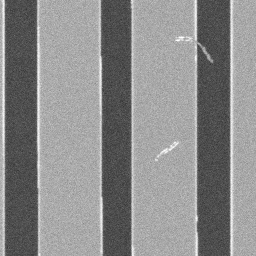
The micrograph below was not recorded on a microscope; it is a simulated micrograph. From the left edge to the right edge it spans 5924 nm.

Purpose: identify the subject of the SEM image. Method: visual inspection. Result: lines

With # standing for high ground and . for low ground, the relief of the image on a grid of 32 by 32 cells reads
.....#######.....########....###
.....#######.....########....###
.....#######.....########....###
.....#######.....########....###
.....#######.....########....###
.....#######.....########....###
.....#######.....########....###
.....#######.....########....###
.....########....########....###
.....########....########....###
.....########....########....###
.....########....########....###
.....########....########....###
.....########....########....###
.....########....########....###
.....########....########....###
.....########....########....###
.....########....########....###
.....########....########....###
.....########....########....###
.....########....########....###
.....########....########....###
.....########....########....###
.....########....########....###
.....########....########....###
.....########....########....###
.....########....########....###
.....########....########....###
.....########....########....###
.....########....########....###
.....########....########....###
.....########....########....###